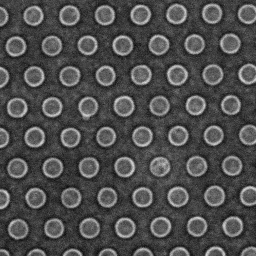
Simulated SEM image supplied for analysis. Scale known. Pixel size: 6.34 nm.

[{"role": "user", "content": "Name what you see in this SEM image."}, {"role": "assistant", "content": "a regular array of raised bodies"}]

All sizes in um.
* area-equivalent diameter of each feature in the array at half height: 0.122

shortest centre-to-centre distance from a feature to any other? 222 nm